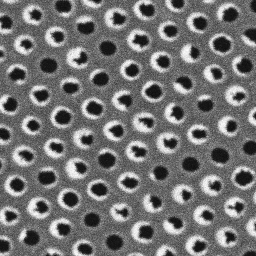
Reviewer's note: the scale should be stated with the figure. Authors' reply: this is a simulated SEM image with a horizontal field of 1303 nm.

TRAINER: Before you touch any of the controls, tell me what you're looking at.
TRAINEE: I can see a regular array of holes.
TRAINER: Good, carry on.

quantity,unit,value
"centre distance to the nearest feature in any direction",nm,152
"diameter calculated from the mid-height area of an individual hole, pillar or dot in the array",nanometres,68.1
